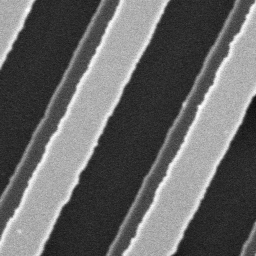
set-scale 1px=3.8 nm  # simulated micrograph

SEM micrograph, lines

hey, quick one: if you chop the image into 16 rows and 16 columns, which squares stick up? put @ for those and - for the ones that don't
@@----@@@@-----@
@-----@@@@----@@
@----@@@@-----@@
-----@@@@----@@@
----@@@@-----@@@
----@@@@----@@@@
---@@@@----@@@@@
---@@@@----@@@@-
--@@@@----@@@@@-
--@@@@----@@@@--
-@@@@----@@@@@--
-@@@@----@@@@---
@@@@----@@@@@---
@@@@----@@@@----
@@@----@@@@-----
@@@----@@@@----@